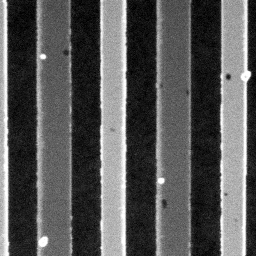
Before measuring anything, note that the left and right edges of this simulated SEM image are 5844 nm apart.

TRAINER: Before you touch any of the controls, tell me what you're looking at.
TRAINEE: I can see lines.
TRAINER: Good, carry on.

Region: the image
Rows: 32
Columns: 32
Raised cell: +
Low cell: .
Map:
+....++++....+++....++++....+++.
+....++++....+++....++++....+++.
+....++++....+++....++++....+++.
+....++++....+++....++++....+++.
+....++++....+++....++++....+++.
+....++++....+++....++++....+++.
+....++++....+++....++++....+++.
+....++++....+++....++++....+++.
+....++++....+++....++++....+++.
+....++++....+++....++++....+++.
+....++++....+++....++++....+++.
+....++++....+++....++++....+++.
+....++++....+++....++++....+++.
+....++++....+++....++++....+++.
+....++++....+++....++++....+++.
+....++++....+++....++++....+++.
+....++++....+++....++++....+++.
+....++++....+++....++++....+++.
+....++++....+++....++++....+++.
+....++++....+++....++++....+++.
+....++++....+++....++++....+++.
+....++++....++.....++++....+++.
+....++++....++.....++++....+++.
+....++++....++.....++++....+++.
+....++++....++.....++++....+++.
+....++++....++.....++++....+++.
+....++++....++.....++++....+++.
+....++++....++.....++++....+++.
+....++++....++.....++++....+++.
+....++++....++.....++++....+++.
+....++++....+++....++++....+++.
+....++++....+++....++++....+++.